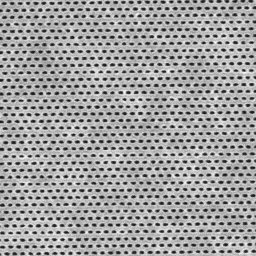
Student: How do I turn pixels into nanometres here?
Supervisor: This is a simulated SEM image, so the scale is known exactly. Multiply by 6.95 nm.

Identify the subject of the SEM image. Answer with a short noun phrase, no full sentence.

a regular array of holes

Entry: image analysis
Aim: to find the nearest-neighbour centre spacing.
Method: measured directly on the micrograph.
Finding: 52.3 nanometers